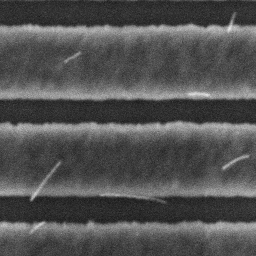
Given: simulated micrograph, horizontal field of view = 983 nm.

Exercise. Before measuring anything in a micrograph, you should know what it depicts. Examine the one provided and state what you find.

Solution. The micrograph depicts lines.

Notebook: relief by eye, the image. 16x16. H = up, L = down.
LLLLLLLLLLLLLLLL
LLLLLLLLLLLLLLLL
HHHHHHHHHHHHHHHH
HHHHHHHHHHHHHHHH
HHHHHHHHHHHHHHHH
HHHHHHHHHHHHHHHH
LLLLLLLLLLLLLLLL
LLLLLLLLLLLLLLLL
HHHHHHHHHHHHHHHH
HHHHHHHHHHHHHHHH
HHHHHHHHHHHHHHHH
HHHHHHHHHHHHHHHH
LLLLLLLLLLLLLLLL
LLLLLLLLLLLLLLLL
HHHHHHHHHHHHHHHH
HHHHHHHHHHHHHHHH